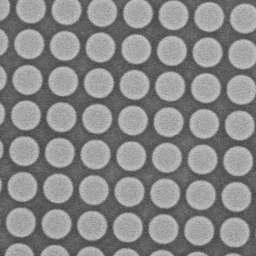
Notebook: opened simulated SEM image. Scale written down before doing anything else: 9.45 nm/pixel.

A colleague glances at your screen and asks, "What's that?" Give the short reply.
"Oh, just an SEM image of an array of small figures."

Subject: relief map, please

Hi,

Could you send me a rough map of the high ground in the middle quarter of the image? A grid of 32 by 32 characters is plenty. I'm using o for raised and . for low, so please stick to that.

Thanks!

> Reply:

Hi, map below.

................................
oo.....ooo......................
ooo...ooooo....ooooo.....ooo....
ooo..ooooooo..ooooooo...ooooo...
ooo..ooooooo..ooooooo..ooooooo..
ooo..ooooooo..ooooooo..ooooooo..
ooo...oooooo..ooooooo..ooooooo..
oo....ooooo....ooooo...ooooooo..
................ooo.....ooooo...
................................
oo.....ooo......................
oo...oooooo....ooooo....oooo....
ooo..ooooooo..oooooo...oooooo...
ooo..ooooooo..ooooooo..ooooooo..
ooo..ooooooo..ooooooo..ooooooo..
oo...oooooo...ooooooo..ooooooo..
o.....ooooo....ooooo...oooooo...
................oo......oooo....
................................
o.....oooo......................
oo...oooooo...ooooo.....oooo....
oo..ooooooo...oooooo...oooooo...
oo..ooooooo..ooooooo..ooooooo..o
oo..ooooooo..ooooooo..ooooooo..o
oo...oooooo..ooooooo..ooooooo..o
......oooo....ooooo....oooooo..o
................oo......oooo....
................................
o.....ooo......oo...............
oo..oooooo....ooooo....oooo.....
oo..ooooooo..ooooooo..oooooo...o
oo..ooooooo..ooooooo..ooooooo..o